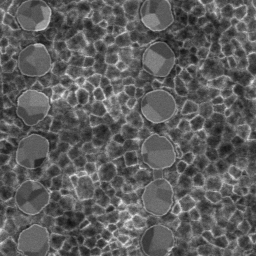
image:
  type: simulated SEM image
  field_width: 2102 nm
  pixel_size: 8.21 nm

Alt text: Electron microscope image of raised bodies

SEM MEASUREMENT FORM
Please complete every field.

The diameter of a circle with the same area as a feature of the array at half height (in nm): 275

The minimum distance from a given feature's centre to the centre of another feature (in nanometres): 379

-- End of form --